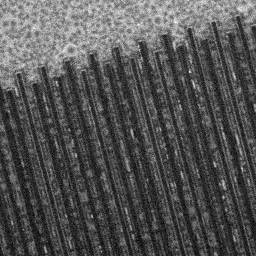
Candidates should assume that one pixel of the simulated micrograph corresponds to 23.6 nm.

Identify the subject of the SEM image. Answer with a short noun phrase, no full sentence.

parallel lines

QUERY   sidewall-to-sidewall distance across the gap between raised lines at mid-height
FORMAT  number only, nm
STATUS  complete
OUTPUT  157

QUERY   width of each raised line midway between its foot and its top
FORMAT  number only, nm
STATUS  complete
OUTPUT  134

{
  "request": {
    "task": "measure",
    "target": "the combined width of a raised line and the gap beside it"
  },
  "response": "0.298 um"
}